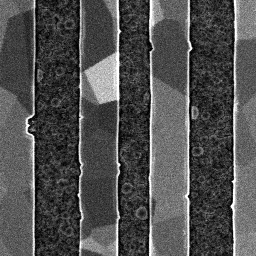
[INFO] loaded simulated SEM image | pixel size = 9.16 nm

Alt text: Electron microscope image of one or a few lines or trenches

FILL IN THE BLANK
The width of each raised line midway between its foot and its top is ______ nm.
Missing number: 356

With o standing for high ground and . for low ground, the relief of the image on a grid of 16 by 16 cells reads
oo...oo..ooo...o
oo...oo..ooo...o
oo...oo..ooo...o
oo...oo..ooo...o
oo...oo..ooo...o
oo...oo..ooo...o
oo...oo..ooo...o
oo...oo..ooo...o
oo...oo..ooo...o
oo...oo..ooo...o
oo...oo..ooo...o
oo...oo..ooo...o
oo...oo..ooo...o
oo...oo..ooo...o
oo...oo..ooo...o
oo...oo..ooo...o